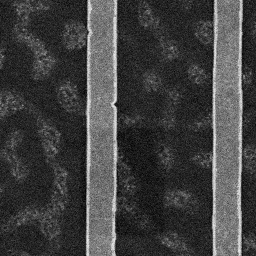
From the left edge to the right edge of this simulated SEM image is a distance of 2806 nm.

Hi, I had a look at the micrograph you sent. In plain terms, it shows one or a few lines or trenches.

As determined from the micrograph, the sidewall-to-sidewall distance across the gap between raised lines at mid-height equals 1.09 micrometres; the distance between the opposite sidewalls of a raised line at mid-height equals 288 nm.